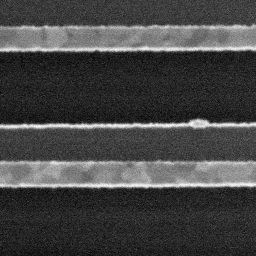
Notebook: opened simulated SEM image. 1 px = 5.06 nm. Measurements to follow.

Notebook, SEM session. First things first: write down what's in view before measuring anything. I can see lines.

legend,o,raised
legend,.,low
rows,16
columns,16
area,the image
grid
oooooooooooooooo
oooooooooooooooo
oooooooooooooooo
................
................
................
................
................
oooooooooooooooo
oooooooooooooooo
oooooooooooooooo
oooooooooooooooo
................
................
................
................